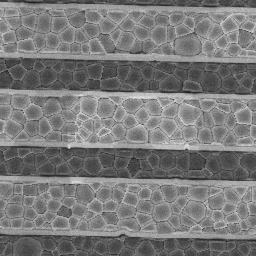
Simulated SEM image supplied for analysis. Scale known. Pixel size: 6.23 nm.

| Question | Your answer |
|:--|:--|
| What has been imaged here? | one or a few lines or trenches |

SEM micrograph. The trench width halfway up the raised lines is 213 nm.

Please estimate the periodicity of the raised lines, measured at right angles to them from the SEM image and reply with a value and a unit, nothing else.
545 nm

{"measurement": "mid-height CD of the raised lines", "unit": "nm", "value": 328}